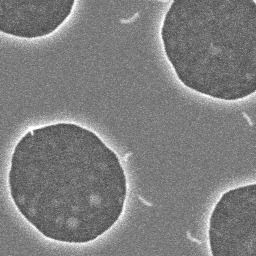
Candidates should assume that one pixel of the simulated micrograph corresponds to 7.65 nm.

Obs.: holes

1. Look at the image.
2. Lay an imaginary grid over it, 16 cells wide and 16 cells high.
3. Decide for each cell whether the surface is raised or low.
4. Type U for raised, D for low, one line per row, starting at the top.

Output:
DDDDDUUUUUUDDDDD
DDDDUUUUUUDDDDDD
UUUUUUUUUUDDDDDD
UUUUUUUUUUDDDDDD
UUUUUUUUUUUDDDDD
UUUUUUUUUUUUDDDD
UUUUUUUUUUUUUUUU
UUUUUUUUUUUUUUUU
UUDDDDUUUUUUUUUU
UDDDDDDUUUUUUUUU
UDDDDDDDUUUUUUUU
UDDDDDDDUUUUUUUU
UDDDDDDDUUUUUUDD
UDDDDDDUUUUUUDDD
UUDDDDDUUUUUUDDD
UUUUUUUUUUUUUDDD